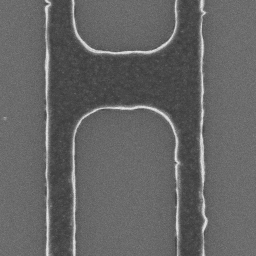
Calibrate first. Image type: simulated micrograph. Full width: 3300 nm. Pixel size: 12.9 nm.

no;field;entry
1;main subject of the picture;one or a few lines or trenches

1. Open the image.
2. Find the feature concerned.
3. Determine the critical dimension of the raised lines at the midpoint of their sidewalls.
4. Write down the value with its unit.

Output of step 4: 350 nm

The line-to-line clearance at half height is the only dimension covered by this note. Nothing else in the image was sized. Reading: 1.31 micrometres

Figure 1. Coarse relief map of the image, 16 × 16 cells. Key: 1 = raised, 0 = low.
0001100000011000
0001100000011000
0001100000011000
0001111111111000
0001111111111000
0001111111111000
0001111111111000
0001100000011000
0001100000011000
0001100000011000
0001100000011000
0001100000011000
0001100000011000
0001100000011000
0001100000011000
0001100000011000